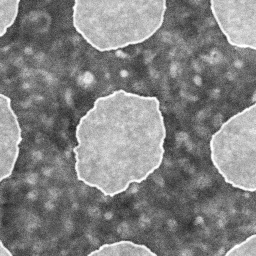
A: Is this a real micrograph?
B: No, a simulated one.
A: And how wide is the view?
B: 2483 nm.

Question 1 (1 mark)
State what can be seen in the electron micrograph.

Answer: raised bodies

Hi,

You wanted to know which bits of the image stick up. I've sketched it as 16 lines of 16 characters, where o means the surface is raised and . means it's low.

o....ooooo...ooo
o....ooooo....oo
.....oooo.....oo
................
................
................
o.....oooo......
o....ooooo....oo
o....ooooo...ooo
o....ooooo...ooo
o....ooooo....oo
......oo.......o
................
................
................
......ooo......o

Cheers